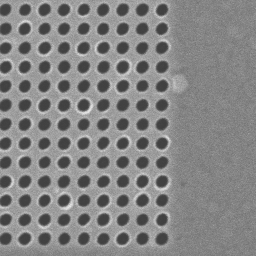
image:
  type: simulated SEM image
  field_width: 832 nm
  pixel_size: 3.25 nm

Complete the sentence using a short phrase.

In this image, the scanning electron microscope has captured a regular array of holes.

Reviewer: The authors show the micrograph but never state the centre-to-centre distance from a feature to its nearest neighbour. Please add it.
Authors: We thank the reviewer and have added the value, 0.0618 µm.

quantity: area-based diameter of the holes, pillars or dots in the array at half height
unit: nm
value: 39.4